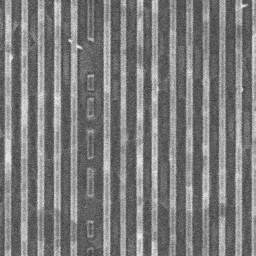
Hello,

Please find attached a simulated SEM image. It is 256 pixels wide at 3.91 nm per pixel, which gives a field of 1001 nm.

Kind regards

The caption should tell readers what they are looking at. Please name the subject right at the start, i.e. parallel lines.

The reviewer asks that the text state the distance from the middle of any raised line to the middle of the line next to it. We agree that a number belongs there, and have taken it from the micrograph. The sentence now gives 64.4 nm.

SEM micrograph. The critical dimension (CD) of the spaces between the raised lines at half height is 0.0454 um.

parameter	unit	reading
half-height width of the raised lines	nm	19